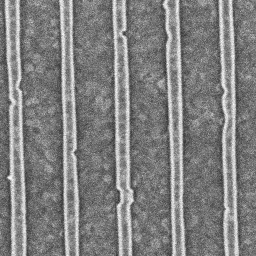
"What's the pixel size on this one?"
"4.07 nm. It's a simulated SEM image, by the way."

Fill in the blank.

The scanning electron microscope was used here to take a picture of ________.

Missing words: parallel lines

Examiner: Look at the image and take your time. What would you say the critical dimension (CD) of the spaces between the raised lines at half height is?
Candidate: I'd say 42.9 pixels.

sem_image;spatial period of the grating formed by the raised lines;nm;217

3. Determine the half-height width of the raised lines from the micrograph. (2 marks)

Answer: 0.0442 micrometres